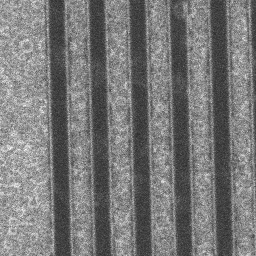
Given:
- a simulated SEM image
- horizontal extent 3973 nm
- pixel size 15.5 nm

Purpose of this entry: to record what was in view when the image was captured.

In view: parallel lines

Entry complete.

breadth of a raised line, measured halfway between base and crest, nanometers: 297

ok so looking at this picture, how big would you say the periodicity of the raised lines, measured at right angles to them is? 628 nm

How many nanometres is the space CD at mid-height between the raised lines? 326